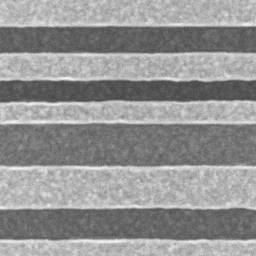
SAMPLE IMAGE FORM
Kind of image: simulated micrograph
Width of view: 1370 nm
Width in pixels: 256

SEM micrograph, lines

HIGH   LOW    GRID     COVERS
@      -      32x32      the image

@@@@@@@@@@@@@@@@@@@@@@@@@@@@@@@@
@@@@@@@@@@@@@@@@@@@@@@@@@@@@@@@@
@@@@@@@@@@@@@@@@@@@@@@@@@@@@@@@@
--------------------------------
--------------------------------
--------------------------------
--------------------------------
@@@@@@@@@@@@@@@@@@@@@@@@@@@@@@@@
@@@@@@@@@@@@@@@@@@@@@@@@@@@@@@@@
@@@@@@@@@@@@@@@@@@@@@@@@@@@@@@@@
--------------------------------
--------------------------------
--------------------------------
@@@@@@@@@@@@@@@@@@@@@@@@@@@@@@@@
@@@@@@@@@@@@@@@@@@@@@@@@@@@@@@@@
--------------------------------
--------------------------------
--------------------------------
--------------------------------
--------------------------------
--------------------------------
@@@@@@@@@@@@@@@@@@@@@@@@@@@@@@@@
@@@@@@@@@@@@@@@@@@@@@@@@@@@@@@@@
@@@@@@@@@@@@@@@@@@@@@@@@@@@@@@@@
@@@@@@@@@@@@@@@@@@@@@@@@@@@@@@@@
@@@@@@@@@@@@@@@@@@@@@@@@@@@@@@@@
--------------------------------
--------------------------------
--------------------------------
--------------------------------
@@@@@@@@@@@@@@@@@@@@@@@@@@@@@@@@
@@@@@@@@@@@@@@@@@@@@@@@@@@@@@@@@